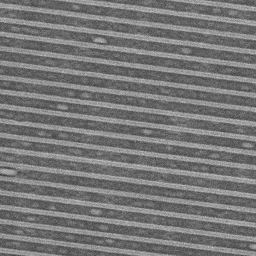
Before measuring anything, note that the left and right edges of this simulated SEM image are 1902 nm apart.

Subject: parallel lines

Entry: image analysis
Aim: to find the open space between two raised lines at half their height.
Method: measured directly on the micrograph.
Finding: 0.0737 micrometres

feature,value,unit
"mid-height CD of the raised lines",33.1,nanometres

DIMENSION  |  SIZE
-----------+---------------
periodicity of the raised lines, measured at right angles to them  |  106 nm